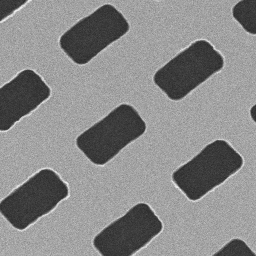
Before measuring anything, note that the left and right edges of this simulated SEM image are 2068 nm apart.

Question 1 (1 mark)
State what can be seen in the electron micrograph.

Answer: holes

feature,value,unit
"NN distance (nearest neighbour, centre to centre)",816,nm